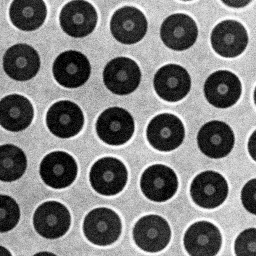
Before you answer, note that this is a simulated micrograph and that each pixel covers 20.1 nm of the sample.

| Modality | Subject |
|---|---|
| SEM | an array of small figures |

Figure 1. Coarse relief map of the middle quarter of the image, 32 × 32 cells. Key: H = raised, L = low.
LHHLLLLHHHLLLLLLLLLHHHHHLLLLLLHH
LHHLLLLHHHLLLLLLLLLHHHHLLLLLLLLH
LLLLLLLHHLLLLHHHLLLHHHHLLLLLLLLH
LLLLLLHHHHLLLHHHLLLHHHLLLLLHLLLL
LLLLLLHHHHLLLLLLLLLHHHLLLLHHLLLL
LLLLLHHHHHLLLLLLLLLHHHLLLLHHLLLL
HHHHHHHHHHHLLLLLLLHHHHLLLLLLLLLL
HHHHHHHHHHHHLLLLLHHHHHHLLLLLLLLH
HHHHHHHHHHHHHHHHHHHHHHHHLLLLLLHH
LLHHHHHHHHHHHHHHHHHHHHHHHLLLLHHH
LLLLHHHHHHHHHLHHHHHHHHHHHHHHHHHH
LLLLLHHHHHLLLLLLHHHHHHHHHHHHHHHH
LLLLLHHHHLLLLLLLLHHHHHHLLLLLHHHH
HLLLLHHHLLLLLLLLLHHHHHLLLLLLLHHH
HLLLLHHHLLLLHLLLLLHHHLLLLLLLLLHH
LLLLLHHHLLLLHHLLLLHHHLLLLLLLLLHH
LLLLLHHHLLLLHLLLLLHHLLLLLHLLLLHH
LLLLHHHHLLLLLLLLLLHHLLLLHHLLLLHH
LLHHHHHHLLLLLLLLLHHHLLLLLLLLLLHH
HHHHHHHHHLLLLLLLHHHHHLLLLLLLLLHH
HHHHHHHHHHHLLLHHHHHHHLLLLLLLLHHH
HHHHHHHHHHHHHHHHHHHHHHHLLLLLHHHH
LLHHHHHHHHHHHHHHHHHHHHHHHHHHHHHH
LLLHHHHHHLLLLLHHHHHHHHHHHHHHHHHH
LLLHHHHLLLLLLLLHHHHHHHHHHHHHHHHH
LLLLHHHLLLLLLLLLHHHHHLLLLLHHHHHH
LLLLHHLLLLLLLLLLHHHHLLLLLLLHHHHH
LLLLHHLLLLHHLLLLHHHLLLLLLLLLHHHH
LLLHHHLLLLHHLLLLHHHLLLLLLLLLLHHH
LLLHHHLLLLLLLLLLHHHLLLLHHLLLLHHH
LLHHHHHLLLLLLLLLHHHLLLLHHLLLLHHL
HHHHHHHLLLLLLLLHHHHLLLLLLLLLHHHL